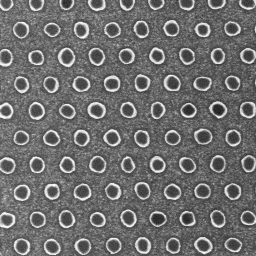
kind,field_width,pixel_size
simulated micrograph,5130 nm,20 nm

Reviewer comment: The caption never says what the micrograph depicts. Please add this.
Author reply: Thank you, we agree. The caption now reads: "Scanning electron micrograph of a regular array of raised bodies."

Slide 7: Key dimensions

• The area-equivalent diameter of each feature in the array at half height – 15.2 px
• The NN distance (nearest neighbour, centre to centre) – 598 nanometers